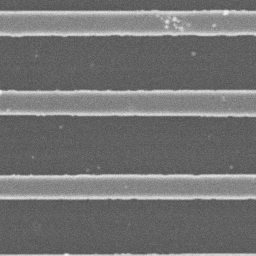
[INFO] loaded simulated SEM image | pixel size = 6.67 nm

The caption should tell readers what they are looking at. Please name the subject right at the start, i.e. lines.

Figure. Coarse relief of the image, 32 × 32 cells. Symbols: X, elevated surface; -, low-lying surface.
--------------------------------
XXXXXXXXXXXXXXXXXXXXXXXXXXXXXXXX
XXXXXXXXXXXXXXXXXXXXXXXXXXXXXXXX
XXXXXXXXXXXXXXXXXXXXXXXXXXXXXXXX
-XX-----------------------------
--------------------------------
--------------------------------
--------------------------------
--------------------------------
--------------------------------
--------------------------------
XXXXXXXXXXXXXXXXXXXXXXXXXXXXXXXX
XXXXXXXXXXXXXXXXXXXXXXXXXXXXXXXX
XXXXXXXXXXXXXXXXXXXXXXXXXXXXXXXX
---------------------------X---X
--------------------------------
--------------------------------
--------------------------------
--------------------------------
--------------------------------
--------------------------------
--------------------------------
XXXXXXXXXXXXXXXXXXXXXXXXXXXXXXXX
XXXXXXXXXXXXXXXXXXXXXXXXXXXXXXXX
XXXXXXXXXXXXXXXXXXXXXXXXXXXXXXXX
--------------------------------
--------------------------------
--------------------------------
--------------------------------
--------------------------------
--------------------------------
--------------------------------